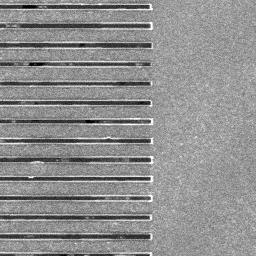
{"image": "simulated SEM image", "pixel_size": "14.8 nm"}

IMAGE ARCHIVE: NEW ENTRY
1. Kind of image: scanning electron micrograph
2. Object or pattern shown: parallel lines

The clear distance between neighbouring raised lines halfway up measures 205 nanometres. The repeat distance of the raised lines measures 283 nm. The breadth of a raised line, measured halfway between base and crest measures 68.4 nanometres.